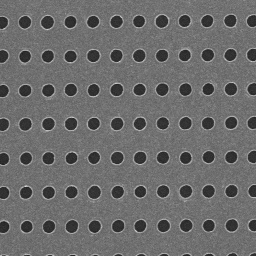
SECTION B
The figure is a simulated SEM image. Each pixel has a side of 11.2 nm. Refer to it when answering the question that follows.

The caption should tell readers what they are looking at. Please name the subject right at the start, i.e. a regular array of holes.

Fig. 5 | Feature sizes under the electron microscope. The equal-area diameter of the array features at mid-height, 140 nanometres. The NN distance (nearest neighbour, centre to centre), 255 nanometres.